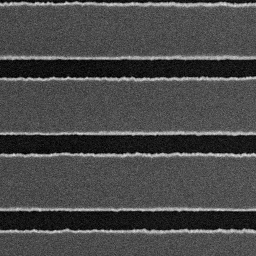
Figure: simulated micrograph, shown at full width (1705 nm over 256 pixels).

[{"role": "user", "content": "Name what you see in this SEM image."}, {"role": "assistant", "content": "lines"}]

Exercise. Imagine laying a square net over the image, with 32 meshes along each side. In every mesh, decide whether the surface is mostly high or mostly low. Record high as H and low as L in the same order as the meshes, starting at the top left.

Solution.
HHHHHHHHHHHHHHHHHHHHHHHHHHHHHHHH
HHHHHHHHHHHHHHHHHHHHHHHHHHHHHHHH
HHHHHHHHHHHHHHHHHHHHHHHHHHHHHHHH
HHHHHHHHHHHHHHHHHHHHHHHHHHHHHHHH
HHHHHHHHHHHHHHHHHHHHHHHHHHHHHHHH
HHHHHHHHHHHHHHHHHHHHHHHHHHHHHHHH
HHHHHHHHHHHHHHHHHHHHHHHHHHHHHHHH
LLLLLLLLLLLLLLLLLLLLLLLLLLLLLLLL
LLLLLLLLLLLLLLLLLLLLLLLLLLLLLLLL
LLLLLLLLLLLLLLLLLLLLLLLLLLLLLLLL
HHHHHHHHHHHHHHHHHHHHHHHHHHHHHHHH
HHHHHHHHHHHHHHHHHHHHHHHHHHHHHHHH
HHHHHHHHHHHHHHHHHHHHHHHHHHHHHHHH
HHHHHHHHHHHHHHHHHHHHHHHHHHHHHHHH
HHHHHHHHHHHHHHHHHHHHHHHHHHHHHHHH
HHHHHHHHHHHHHHHHHHHHHHHHHHHHHHHH
HHHHHHHHHHHHHHHHHHHHHHHHHHHHHHHH
LLLLLLLLLLLLLLLLLLLLLLLLLLLLLLLL
LLLLLLLLLLLLLLLLLLLLLLLLLLLLLLLL
HHHHHHHHHHHHHHHHHHHHHHHHHHHHHHHH
HHHHHHHHHHHHHHHHHHHHHHHHHHHHHHHH
HHHHHHHHHHHHHHHHHHHHHHHHHHHHHHHH
HHHHHHHHHHHHHHHHHHHHHHHHHHHHHHHH
HHHHHHHHHHHHHHHHHHHHHHHHHHHHHHHH
HHHHHHHHHHHHHHHHHHHHHHHHHHHHHHHH
HHHHHHHHHHHHHHHHHHHHHHHHHHHHHHHH
LLLLLLLLLLLLLLLLLLLLLLLLLLLLLLLL
LLLLLLLLLLLLLLLLLLLLLLLLLLLLLLLL
LLLLLLLLLLLLLLLLLLLLLLLLLLLLLLLL
HHHHHHHHHHHHHHHHHHHHHHHHHHHHHHHH
HHHHHHHHHHHHHHHHHHHHHHHHHHHHHHHH
HHHHHHHHHHHHHHHHHHHHHHHHHHHHHHHH